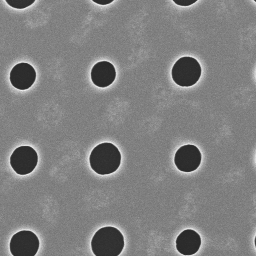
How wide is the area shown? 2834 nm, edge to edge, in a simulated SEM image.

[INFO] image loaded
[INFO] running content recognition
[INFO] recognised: holes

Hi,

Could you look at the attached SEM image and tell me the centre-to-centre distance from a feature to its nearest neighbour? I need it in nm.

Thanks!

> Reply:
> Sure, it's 900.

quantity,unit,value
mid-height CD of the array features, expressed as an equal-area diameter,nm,303